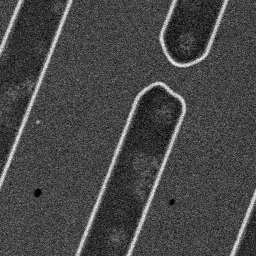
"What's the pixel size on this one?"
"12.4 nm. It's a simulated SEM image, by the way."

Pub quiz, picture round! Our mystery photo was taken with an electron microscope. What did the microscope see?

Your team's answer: one or a few lines or trenches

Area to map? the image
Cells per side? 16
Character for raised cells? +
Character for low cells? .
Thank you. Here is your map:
+...+++++++...++
+...++++++....++
...+++++++...+++
...++++++++..+++
...+++++++++++++
..+++++++.++++++
..++++++...+++++
..++++++...+++++
.+++++++...+++++
.++++++....+++++
+++++++...++++++
+++++++...++++++
++++++...+++++++
++++++...++++++.
+++++....++++++.
+++++...+++++++.